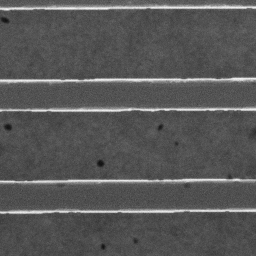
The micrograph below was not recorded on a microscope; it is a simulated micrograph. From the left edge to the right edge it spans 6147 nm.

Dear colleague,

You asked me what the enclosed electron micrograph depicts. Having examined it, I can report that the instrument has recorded lines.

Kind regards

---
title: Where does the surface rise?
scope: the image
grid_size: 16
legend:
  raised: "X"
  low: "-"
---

XXXXXXX---------
----------------
----------------
----------------
----------------
XXXXXXXXXXXXXXXX
XXXXXXXXXXXXXXXX
----------------
----------------
----------------
----------------
XXXXXXXXXXXXXXXX
XXXXXXXXXXXXXXXX
----------------
----------------
----------------